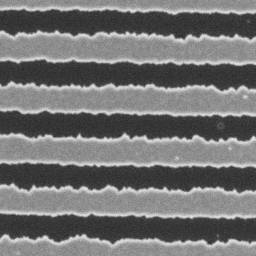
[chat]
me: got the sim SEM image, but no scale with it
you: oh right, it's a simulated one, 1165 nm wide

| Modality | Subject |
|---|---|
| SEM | lines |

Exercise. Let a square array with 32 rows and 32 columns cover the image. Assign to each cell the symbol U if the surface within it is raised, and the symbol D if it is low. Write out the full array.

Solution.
UUUUUUUUUUUUUUUUUUUUUUUUUUUUUUUU
DDDDDDDDDDDDDDDDDDDDDUUUUUUUUUUU
DDDDDDDDDDDDDDDDDDDDDDDDDDDDDDDD
DDDDDDDDDDDDDDDDDDDDDDDDDDDDDDDD
UUUUUUUUUUUUUUUUUUUUUDDDDUDDDUDD
UUUUUUUUUUUUUUUUUUUUUUUUUUUUUUUU
UUUUUUUUUUUUUUUUUUUUUUUUUUUUUUUU
UUUUDDUUUUUUUUUUUUUUUUUUUUUUUUUU
DDDDDDDDDDDDDDDDDDDDDDDDDDDDDDDD
DDDDDDDDDDDDDDDDDDDDDDDDDDDDDDDD
DUDDDDDDDDDDDDDDDDDDDDDDDDDDDDDD
UUUUUUUUUUUUUUUUUUUUUUUUUUUUUUUU
UUUUUUUUUUUUUUUUUUUUUUUUUUUUUUUU
UUUUUUUUUUUUUUUUUUUUUUUUUUUUUUUU
DDDDDDDDDDDDDDDDDDDDDDDDDDDDDDDD
DDDDDDDDDDDDDDDDDDDDDDDDDDDDDDDD
DDDDDDDDDDDDDDDDDDDDDDDDDDDDDDDD
UUUUUUUUUUUUUUUUUUUUUUUUUUDDUUDU
UUUUUUUUUUUUUUUUUUUUUUUUUUUUUUUU
UUUUUUUUUUUUUUUUUUUUUUUUUUUUUUUU
DDDDDDDUUUUUUUUUUUUUUUUUUUUUUUUU
DDDDDDDDDDDDDDDDDDDDDDDDDDDDDDDD
DDDDDDDDDDDDDDDDDDDDDDDDDDDDDDDD
UUDDUUUDUDUDDUDDDDDDDDDDUDDUDDDD
UUUUUUUUUUUUUUUUUUUUUUUUUUUUUUUU
UUUUUUUUUUUUUUUUUUUUUUUUUUUUUUUU
UUUUUUUUUUUUUUUUUUUUUUUUUUUUUUUU
DDDDDDDDDDDDDDDDDDDDDDDDDDDDDDDD
DDDDDDDDDDDDDDDDDDDDDDDDDDDDDDDD
UDDDDDDDDDUDDDDDDDDDDDDDDDDDDDDD
UUUUUUUUUUUUUUUUUUUUUUUUUUDUUUUU
UUUUUUUUUUUUUUUUUUUUUUUUUUUUUUUU